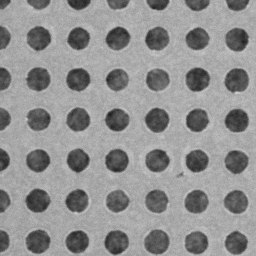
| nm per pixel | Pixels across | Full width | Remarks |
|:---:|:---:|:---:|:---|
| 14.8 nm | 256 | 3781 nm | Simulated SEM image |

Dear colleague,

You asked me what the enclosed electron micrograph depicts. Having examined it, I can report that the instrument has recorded a regular array of holes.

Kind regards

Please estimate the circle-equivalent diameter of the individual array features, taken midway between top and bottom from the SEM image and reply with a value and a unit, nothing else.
0.374 µm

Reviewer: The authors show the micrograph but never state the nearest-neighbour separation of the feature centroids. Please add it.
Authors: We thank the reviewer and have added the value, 580 nm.